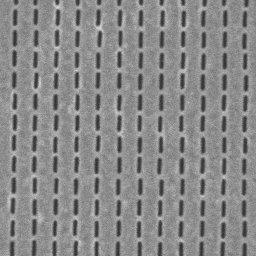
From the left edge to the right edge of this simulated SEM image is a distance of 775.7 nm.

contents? a regular array of holes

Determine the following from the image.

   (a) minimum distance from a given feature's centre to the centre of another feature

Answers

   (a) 0.0615 microns